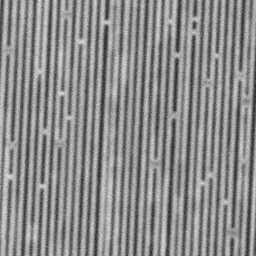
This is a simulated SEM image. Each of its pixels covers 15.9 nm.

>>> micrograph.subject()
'parallel lines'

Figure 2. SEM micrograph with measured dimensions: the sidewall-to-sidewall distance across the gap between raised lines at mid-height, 59.6 nm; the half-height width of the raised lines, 0.0735 micrometres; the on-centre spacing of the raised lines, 128 nanometres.